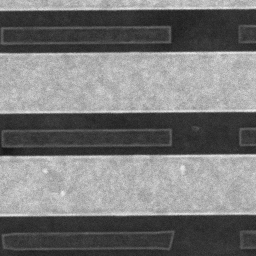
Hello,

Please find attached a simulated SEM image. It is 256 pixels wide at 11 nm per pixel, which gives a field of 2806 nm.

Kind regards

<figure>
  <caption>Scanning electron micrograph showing wiring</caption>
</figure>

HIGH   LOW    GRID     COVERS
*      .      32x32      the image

********************************
................................
................................
...........**********.........**
*********************.........**
................................
................................
********************************
********************************
********************************
********************************
********************************
********************************
********************************
................................
................................
.********************.........**
*********************.........**
................................
................................
********************************
********************************
********************************
********************************
********************************
********************************
********************************
................................
................................
.*********************........**
*********************.........**
................................